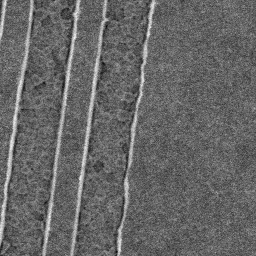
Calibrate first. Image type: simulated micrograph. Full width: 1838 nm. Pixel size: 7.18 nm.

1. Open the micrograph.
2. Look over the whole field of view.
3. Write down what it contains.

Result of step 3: one or a few lines or trenches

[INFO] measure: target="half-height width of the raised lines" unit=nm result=202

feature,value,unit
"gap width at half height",45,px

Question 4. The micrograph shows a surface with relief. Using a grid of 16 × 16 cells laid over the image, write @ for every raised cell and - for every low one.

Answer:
@@---@@--@@@@@@@
@@---@---@@@@@@@
@@---@---@@@@@@@
@@--@@---@@@@@@@
@---@@---@@@@@@@
@---@@---@@@@@@@
@---@@---@@@@@@@
@---@@--@@@@@@@@
@---@---@@@@@@@@
@---@---@@@@@@@@
@--@@---@@@@@@@@
---@@---@@@@@@@@
---@@---@@@@@@@@
---@@---@@@@@@@@
---@@--@@@@@@@@@
---@@--@@@@@@@@@